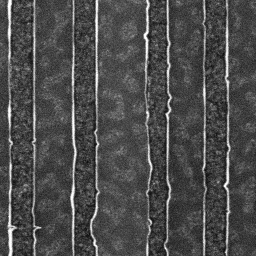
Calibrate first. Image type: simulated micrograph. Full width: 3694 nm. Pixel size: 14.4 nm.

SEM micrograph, one or a few lines or trenches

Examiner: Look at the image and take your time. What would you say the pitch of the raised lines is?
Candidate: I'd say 0.933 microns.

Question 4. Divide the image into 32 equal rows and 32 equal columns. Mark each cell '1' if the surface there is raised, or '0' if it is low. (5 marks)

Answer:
01110000011100000011100001110000
01110000011100000011100000110000
01110000011100000011100001110000
01110000011100000011100000110000
01110000011100000011100000110000
01110000011100000011100000110000
01110000011100000011100000110000
01110000011100000011100001110000
01110000011100000011100001110000
01110000011100000011100001110000
01110000011100000011100000110000
01110000011100000011100000110000
01110000011100000011100000111000
01110000011100000011100000111000
01110000011100000011100000111000
01110000011100000011100000111000
01110000011100000011100000111000
01110000011100000001100000110000
01110000011100000001100000111000
01110000011100000001100000110000
01110000011100000001100001111000
01110000011100000001100001111000
01110000011100000001100000111000
01110000011100000011100000110000
01110000011100000011100000110000
01110000011100000001100000110000
01110000011100000001100000111000
01110000011100000001100000110000
01111000011000000001100000110000
01110000011100000011100000110000
01110000011100000011100000110000
01110000011100000011100000110000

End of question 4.